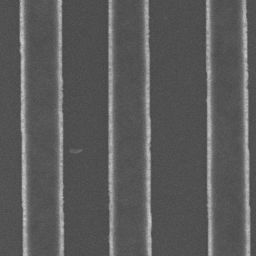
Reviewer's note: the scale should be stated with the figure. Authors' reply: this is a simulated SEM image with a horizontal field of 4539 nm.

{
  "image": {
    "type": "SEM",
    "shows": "lines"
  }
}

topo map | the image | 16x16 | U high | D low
DUUUDDDUUDDDDUUD
DUUUDDDUUDDDDUUD
DUUUDDDUUDDDDUUD
DUUUDDDUUDDDDUUD
DUUUDDDUUDDDDUUD
DUUUDDDUUDDDDUUD
DUUUDDDUUDDDDUUD
DUUUDDDUUDDDDUUD
DUUUDDDUUDDDDUUD
DUUUDDDUUDDDDUUD
DUUUDDDUUDDDDUUD
DUUUDDDUUDDDDUUU
DUUUDDDUUDDDDUUU
DUUUDDDUUDDDDUUU
DUUUDDDUUDDDDUUU
DDUUDDDUUDDDDUUU